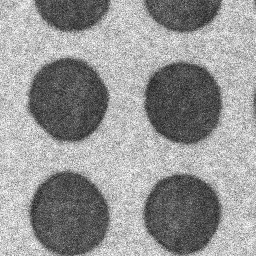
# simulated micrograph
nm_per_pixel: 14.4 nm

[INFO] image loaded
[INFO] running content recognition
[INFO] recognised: holes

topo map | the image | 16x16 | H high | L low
HHLLLLLHHLLLLLHH
HHHLLLHHHHLLLHHH
HHHHHHHHHHHHHHHH
HHHHHHHHHHHHHHHH
HHLLLLHHHHLLLHHH
HHLLLLLHHLLLLLHH
HHLLLLLHHLLLLLHH
HHLLLLHHHLLLLLHH
HHHLLLHHHHLLLHHH
HHHHHHHHHHHHHHHH
HHHHHHHHHHHHHHHH
HHHLLLHHHHLLLHHH
HHLLLLLHHLLLLLHH
HHLLLLLHHLLLLLHH
HHLLLLLHHLLLLHHH
HHHLLLHHHHLLLHHH